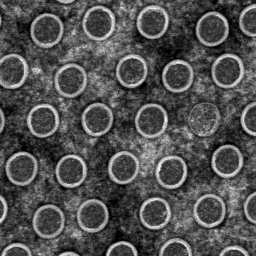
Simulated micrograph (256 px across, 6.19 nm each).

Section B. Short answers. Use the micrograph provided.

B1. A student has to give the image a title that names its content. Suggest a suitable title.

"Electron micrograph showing a regular array of raised bodies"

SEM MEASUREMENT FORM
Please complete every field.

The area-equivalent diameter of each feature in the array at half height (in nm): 188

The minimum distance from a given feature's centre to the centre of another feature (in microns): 0.294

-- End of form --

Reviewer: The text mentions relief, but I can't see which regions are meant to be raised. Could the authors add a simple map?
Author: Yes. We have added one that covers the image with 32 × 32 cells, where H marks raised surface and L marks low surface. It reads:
LLLLLLLLLLLLLLLLLLLLLLLLLLLLLLLL
LLLLLLLLLLLHHHLLLLHHHLLLLLLLLLHH
LLLLHHHLLLLHHHLLLHHHHLLLLHHHLLHH
LLLLHHHHLLLHHHLLLHHHHLLLLHHHLLHH
LLLLHHHHLLLHHLLLLLHHLLLLLHHHLLLL
LLLLLHHLLLLLLLLLLLLLLLLLLLHLLLLL
LLLLLLLLLLLLLLLLLLLLLLLLLLLLLLLL
HHHLLLLLLLLLLLLHHHLLLLLLLLLHHHLL
HHHLLLLLHHLLLLLHHHLLLHHHLLLHHHLL
HHHLLLLHHHHLLLLHHHLLHHHHLLLHHHLL
HHHLLLLHHHHLLLLHHLLLLHHHLLLHHLLL
LLLLLLLLHHLLLLLLLLLLLLLLLLLLLLLL
LLLLLLLLLLLLLLLLLLLLLLLLLLLLLLLL
LLLLHHHLLLLHHLLLLLHHLLLLLLLLLLLH
LLLLHHHLLLHHHHLLLHHHHLLLLLLLLLHH
LLLLHHHLLLHHHHLLLHHHHLLLLLLLLLHH
LLLLHHHLLLLHHLLLLLHHLLLLLLLLLLLH
LLLLLLLLLLLLLLLLLLLLLLLLLLLLLLLL
LLLLLLLLLLLLLLLLLLLLLLLLLLLLHLLL
LLHHLLLLHLLLLLHHHLLLLLLLLLLHHHLL
LHHHLLLHHHHLLLHHHLLLHHHLLLLHHHLL
LHHHLLLHHHHLLLHHHLLLHHHLLLLHHHLL
LHHHLLLHHHLLLLHHLLLLHHHLLLLLLLLL
LLLLLLLLLLLLLLLLLLLLLLLLLLLLLLLL
LLLLLLLLLLLLLLLLLLLLLLLLLLHLLLLH
HLLLLLLLLLLHHLLLLLHHHLLLLHHHLLLH
HLLLLHHLLLHHHLLLLLHHHLLLHHHHLLLH
LLLLHHHHLLHHHLLLLLHHHLLLLHHHLLLH
LLLLHHHHLLHHHLLLLLLLLLLLLLLLLLLL
LLLLLHHLLLLLLLLLLLLLLLLLLLLLLLLL
LLLLLLLLLLLLLLHHLLLLLHHLLLLLLLLL
HHHHLLLLLLLLLLHHHLLLHHHHLLLLHHHL